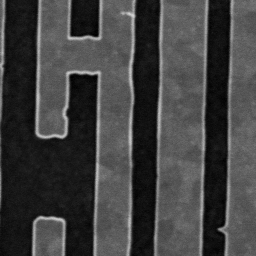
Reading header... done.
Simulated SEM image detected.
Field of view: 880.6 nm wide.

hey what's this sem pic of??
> one or a few lines or trenches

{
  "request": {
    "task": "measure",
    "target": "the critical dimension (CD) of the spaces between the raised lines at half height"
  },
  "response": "93.2 nm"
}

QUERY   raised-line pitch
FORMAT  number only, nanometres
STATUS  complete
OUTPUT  225